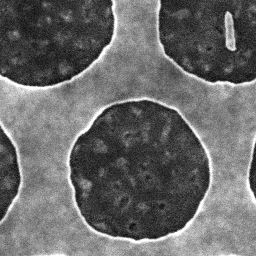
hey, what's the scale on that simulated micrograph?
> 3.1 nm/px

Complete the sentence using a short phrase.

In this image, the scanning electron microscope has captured holes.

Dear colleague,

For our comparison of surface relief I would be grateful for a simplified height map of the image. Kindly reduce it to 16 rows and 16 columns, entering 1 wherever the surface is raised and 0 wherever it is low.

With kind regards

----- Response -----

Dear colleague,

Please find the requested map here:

0000000111000000
0000000111000000
0000000111000010
0000001111100000
0000011111110000
1111111111111111
1111111000111111
1111110000001111
1111100000001111
0111000000000111
0111000000000111
0111000000000111
0111100000000111
1111100000001111
1111110000011111
1111111111111111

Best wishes